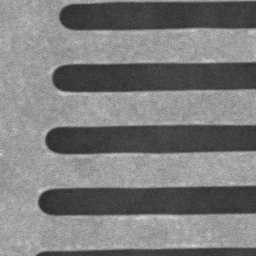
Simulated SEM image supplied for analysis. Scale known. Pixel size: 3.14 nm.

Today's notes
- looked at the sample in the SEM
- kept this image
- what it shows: groups of lines, slits or small figures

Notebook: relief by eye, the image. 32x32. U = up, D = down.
UUUUUUUUUDDDDDDDDDDDDDDDDDDDDDDD
UUUUUUUDDDDDDDDDDDDDDDDDDDDDDDDD
UUUUUUUDDDDDDDDDDDDDDDDDDDDDDDDD
UUUUUUUUDDDDDDDDDDDDDDDDDDDDDDDD
UUUUUUUUUUUUUUUUUUUUUUUUUUUUUUUU
UUUUUUUUUUUUUUUUUUUUUUUUUUUUUUUU
UUUUUUUUUUUUUUUUUUUUUUUUUUUUUUUU
UUUUUUUUUUUUUUUUUUUUUUUUUUUUUUUU
UUUUUUUDDDDDDDDDDDDDDDDDDDDDDDDD
UUUUUUUDDDDDDDDDDDDDDDDDDDDDDDDD
UUUUUUUDDDDDDDDDDDDDDDDDDDDDDDDD
UUUUUUUUDDDDDDDDDUUUUUUUUUUUUUUU
UUUUUUUUUUUUUUUUUUUUUUUUUUUUUUUU
UUUUUUUUUUUUUUUUUUUUUUUUUUUUUUUU
UUUUUUUUUUUUUUUUUUUUUUUUUUUUUUUU
UUUUUUUUUUUUUUUUUUUUUUUUUUUUUUUU
UUUUUUDDDDDDDDDDDDDDDDDDDDDDDDDD
UUUUUUDDDDDDDDDDDDDDDDDDDDDDDDDD
UUUUUUDDDDDDDDDDDDDDDDDDDDDDDDDD
UUUUUUUUUUUUUUUUUUUUUUUUUUUUUUUU
UUUUUUUUUUUUUUUUUUUUUUUUUUUUUUUU
UUUUUUUUUUUUUUUUUUUUUUUUUUUUUUUU
UUUUUUUUUUUUUUUUUUUUUUUUUUUUUUUU
UUUUUUUDDDDDDDDDDDDDDDDDDDDDDDDD
UUUUUDDDDDDDDDDDDDDDDDDDDDDDDDDD
UUUUUDDDDDDDDDDDDDDDDDDDDDDDDDDD
UUUUUDDDDDDDDDDDDDDDDDDDDDDDDDDD
UUUUUUUUUUUUUUUUUUUUUUUUUUUUUUUU
UUUUUUUUUUUUUUUUUUUUUUUUUUUUUUUU
UUUUUUUUUUUUUUUUUUUUUUUUUUUUUUUU
UUUUUUUUUUUUUUUUUUUUUUUUUUUUUUUU
UUUUUDDDDDDDDDDDDDDDDDDDDDDDDDDD